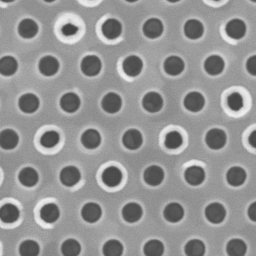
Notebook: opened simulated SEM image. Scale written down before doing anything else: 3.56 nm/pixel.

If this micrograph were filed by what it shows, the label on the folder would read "a regular array of holes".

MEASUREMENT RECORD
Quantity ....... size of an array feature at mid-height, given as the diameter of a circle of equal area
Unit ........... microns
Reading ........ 0.0749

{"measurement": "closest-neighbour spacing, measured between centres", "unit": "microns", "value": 0.147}